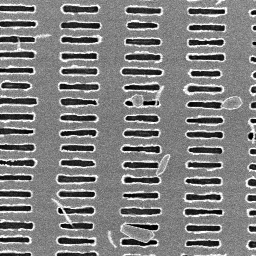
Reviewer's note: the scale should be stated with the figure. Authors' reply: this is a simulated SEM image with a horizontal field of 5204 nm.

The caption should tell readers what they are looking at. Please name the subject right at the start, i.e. a regular array of holes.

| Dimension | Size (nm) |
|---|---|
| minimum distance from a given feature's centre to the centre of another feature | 308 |